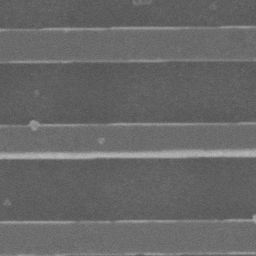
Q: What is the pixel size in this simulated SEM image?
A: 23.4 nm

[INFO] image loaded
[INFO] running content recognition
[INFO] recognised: lines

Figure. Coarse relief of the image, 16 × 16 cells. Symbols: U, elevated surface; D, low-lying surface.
DDDDDDDDDDDDDDDD
DDDDDDDDDDDDDDDD
UUUUUUUUUUUUUUUU
UUUUUUUUUUUUUUUU
DDDDDDDDDDDDDDDD
DDDDDDDDDDDDDDDD
DDDDDDDDDDDDDDDD
DDDDDDDDDDDDDDDD
UUUUUUUUUUUUUUUU
UUUUUUUUUUUUUUUU
DDDDDDDDDDDDDDDD
DDDDDDDDDDDDDDDD
DDDDDDDDDDDDDDDD
DDDDDDDDDDDDDDDD
UUUUUUUUUUUUUUUU
UUUUUUUUUUUUUUUU